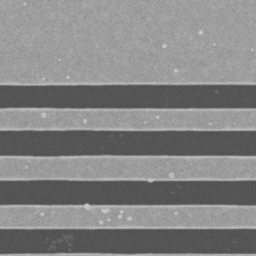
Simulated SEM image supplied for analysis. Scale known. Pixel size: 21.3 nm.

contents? wiring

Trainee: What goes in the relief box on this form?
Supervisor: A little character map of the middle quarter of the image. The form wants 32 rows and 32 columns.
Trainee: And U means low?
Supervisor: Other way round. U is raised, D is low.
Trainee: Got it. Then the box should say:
UUUUUUUUUUUUUUUUUUUUUUUUUUUUUUUU
UUUUUUUUUUUUUUUUUUUUUUUUUUUUUUUU
UUUUUUUUUUUUUUUUUUUUUUUUUUUUUUUU
UUUUUUUUUUUUUUUUUUUUUUUUUUUUUUUU
UUUUUUUUUUUUUUUUUUUUUUUUUUUUUUUU
DDDDDDDDDDDDDDDDDDDDDDDDDDDDDDDD
DDDDDDDDDDDDDDDDDDDDDDDDDDDDDDDD
DDDDDDDDDDDDDDDDDDDDDDDDDDDDDDDD
DDDDDDDDDDDDDDDDDDDDDDDDDDDDDDDD
DDDDDDDDDDDDDDDDDDDDDDDDDDDDDDDD
DDDDDDDDDDDDDDDDDDDDDDDDDDDDDDDD
UUUUUUUUUUUUUUUUUUUUUUUUUUUUUUUU
UUUUUUUUUUUUUUUUUUUUUUUUUUUUUUUU
UUUUUUUUUUUUUUUUUUUUUUUUUUUUUUUU
UUUUUUUUUUUUUUUUUUUUUUUUUUUUUUUU
UUUUUUUUUUUUUUUUUUUUUUUUUUUUUUUU
DDDDDDDDDDDDDDDDDDDDDDDDDDDDDDDD
DDDDDDDDDDDDDDDDDDDDDDDDDDDDDDDD
DDDDDDDDDDDDDDDDDDDDDDDDDDDDDDDD
DDDDDDDDDDDDDDDDDDDDDDDDDDDDDDDD
DDDDDDDDDDDDDDDDDDDDDDDDDDDDDDDD
DDDDDDDDDDDDDDDDDDDDDDDDDDDDDDDD
DDDDDDDDDDDDDDDDDDDDDDDDDDDDDDDD
UUUUUUUUUUUUUUUUUUUUUUUUUUUUUUUU
UUUUUUUUUUUUUUUUUUUUUUUUUUUUUUUU
UUUUUUUUUUUUUUUUUUUUUUUUUUUUUUUU
UUUUUUUUUUUUUUUUUUUUUUUUUUUUUUUU
UUUUUUUUUUUUUUUUUUUUUUUUUUUUUUUU
UUUUUUUUUUUUUUUUUUUUUUUUUUUUUUUU
DDDDDDDDDDDDDDDDDDDDDDDDDDDDDDDD
DDDDDDDDDDDDDDDDDDDDDDDDDDDDDDDD
DDDDDDDDDDDDDDDDDDDDDDDDDDDDDDDD